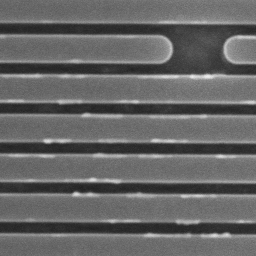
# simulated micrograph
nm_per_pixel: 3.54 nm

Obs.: parallel lines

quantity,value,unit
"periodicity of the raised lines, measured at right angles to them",141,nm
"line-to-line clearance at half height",44.3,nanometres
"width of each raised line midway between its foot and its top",97.9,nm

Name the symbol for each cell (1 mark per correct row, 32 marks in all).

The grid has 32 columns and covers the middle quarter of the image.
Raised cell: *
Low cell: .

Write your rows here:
................................
................................
................................
********************************
********************************
********************************
********************************
********************************
********************************
*****........*******************
................................
................................
.....**.........................
********************************
********************************
********************************
********************************
********************************
********************************
*.....************......********
................................
................................
.......***......................
********************************
********************************
********************************
********************************
********************************
********************************
***.*......****.................
................................
................................